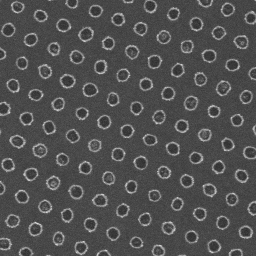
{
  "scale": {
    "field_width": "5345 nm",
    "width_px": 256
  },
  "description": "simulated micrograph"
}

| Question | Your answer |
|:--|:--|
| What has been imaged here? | a regular array of raised bodies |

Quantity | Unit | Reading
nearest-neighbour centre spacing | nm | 507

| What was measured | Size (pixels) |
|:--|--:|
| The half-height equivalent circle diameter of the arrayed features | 12.2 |